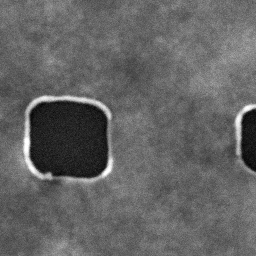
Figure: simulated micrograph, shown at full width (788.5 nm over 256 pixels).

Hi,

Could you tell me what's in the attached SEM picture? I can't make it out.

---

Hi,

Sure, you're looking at holes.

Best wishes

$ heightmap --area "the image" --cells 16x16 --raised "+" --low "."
++++++++++++++++
++++++++++++++++
++++++++++++++++
++++++++++++++++
++++++++++++++++
++++++++++++++++
++....++++++++++
++.....++++++++.
++.....++++++++.
++.....++++++++.
++.....+++++++++
++++++++++++++++
++++++++++++++++
++++++++++++++++
++++++++++++++++
++++++++++++++++